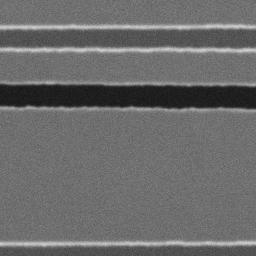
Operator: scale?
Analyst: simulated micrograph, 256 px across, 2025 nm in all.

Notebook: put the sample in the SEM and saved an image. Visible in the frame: lines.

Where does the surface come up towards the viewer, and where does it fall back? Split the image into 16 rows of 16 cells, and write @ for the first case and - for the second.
@@@@@@@@@@@@@@@@
@@@@@@@@@@@@@@@@
@@@@@@@@@@@@@@@@
@@@@@@@@@@@@@@@@
@@@@@@@@@@@@@@@@
----------------
----------------
@@@@@@@@@@@@@@@@
@@@@@@@@@@@@@@@@
@@@@@@@@@@@@@@@@
@@@@@@@@@@@@@@@@
@@@@@@@@@@@@@@@@
@@@@@@@@@@@@@@@@
@@@@@@@@@@@@@@@@
@@@@@@@@@@@@@@@@
@@@@@@@@@@@@@@@@